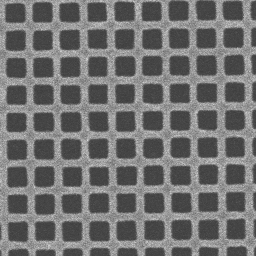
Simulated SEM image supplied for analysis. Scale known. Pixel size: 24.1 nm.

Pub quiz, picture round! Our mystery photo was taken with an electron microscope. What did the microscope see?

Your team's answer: a regular array of holes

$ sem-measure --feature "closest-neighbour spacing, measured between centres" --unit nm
650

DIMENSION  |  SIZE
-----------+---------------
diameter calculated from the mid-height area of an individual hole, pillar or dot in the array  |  555 nanometres